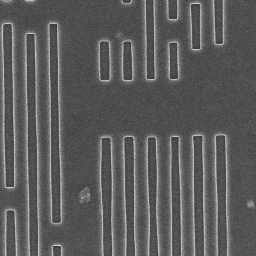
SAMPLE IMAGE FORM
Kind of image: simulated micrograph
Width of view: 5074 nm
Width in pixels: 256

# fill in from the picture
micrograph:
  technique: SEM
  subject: groups of lines, slits or small figures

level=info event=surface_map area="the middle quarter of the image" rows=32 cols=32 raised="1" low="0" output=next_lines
11111111100011100111000111000111
11111111100011100111100111000111
11111111100011100111100111000111
11111111100011100111100111000111
11111111111111111111111111111111
11111111111111111111111111111111
11111111111111111111111111111111
11111111111111111111111111111111
11111111111111111111111111111111
11111111111111111111111111111111
11111111111111111111111111111111
11111111111111111111111111111111
11111111111111111111111111111111
11111111111111111111111111111111
11111111111111111111111111111111
11111111111111111111111111111111
11111111111111111111111111111111
11111111111111111111111111111111
11111111100111100111100111100111
11111111100011100011100111100111
11111111100011100011100111100111
11111111100011100011100111100111
11111111100011100011100111100111
11111111100011100011100111100111
11111111100011100011100111100111
11111111100011100011100111100111
11111111100011100011100111100111
11111111100011100011100111100111
11111111100011100011100111100111
11111111100011100011100111100111
11111111100011100011100111100111
11111111100011100011100111100111